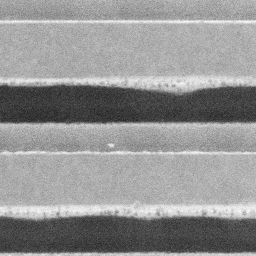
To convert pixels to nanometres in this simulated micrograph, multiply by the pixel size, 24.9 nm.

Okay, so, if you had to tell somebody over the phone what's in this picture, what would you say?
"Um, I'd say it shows lines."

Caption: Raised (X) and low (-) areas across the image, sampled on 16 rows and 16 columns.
XXXXXXXXXXXXXXXX
XXXXXXXXXXXXXXXX
XXXXXXXXXXXXXXXX
XXXXXXXXXXXXXXXX
XXXXXXXXXXXXXXXX
----------------
----------------
----------------
XXXXXXXXXXXXXXXX
XXXXXXXXXXXXXXXX
XXXXXXXXXXXXXXXX
XXXXXXXXXXXXXXXX
XXXXXXXXXXXXXXXX
----------------
----------------
----------------